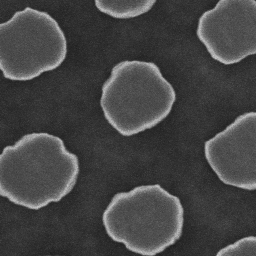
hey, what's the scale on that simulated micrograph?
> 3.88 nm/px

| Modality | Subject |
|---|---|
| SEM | raised bodies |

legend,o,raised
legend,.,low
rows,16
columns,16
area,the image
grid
......ooo....ooo
ooo..........ooo
oooo.........ooo
oooo.........oo.
ooo....ooo......
.......oooo.....
......ooooo.....
.......ooo.....o
..o..........ooo
oooo.........ooo
ooooo........ooo
oooo..........oo
.oo....oooo.....
.......oooo.....
.......oooo.....
........oo....oo